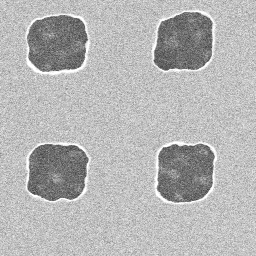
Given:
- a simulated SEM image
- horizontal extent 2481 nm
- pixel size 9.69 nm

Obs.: holes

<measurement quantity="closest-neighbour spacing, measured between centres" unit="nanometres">1240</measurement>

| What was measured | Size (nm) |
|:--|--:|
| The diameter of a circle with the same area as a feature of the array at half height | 598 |